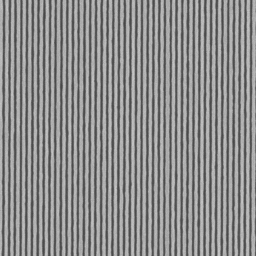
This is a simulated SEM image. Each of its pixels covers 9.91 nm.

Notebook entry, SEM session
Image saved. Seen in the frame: parallel lines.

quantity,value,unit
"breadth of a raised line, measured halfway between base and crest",27.2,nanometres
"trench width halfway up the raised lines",2.74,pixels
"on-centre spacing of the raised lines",56.9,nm